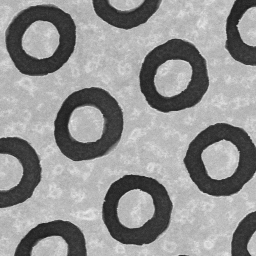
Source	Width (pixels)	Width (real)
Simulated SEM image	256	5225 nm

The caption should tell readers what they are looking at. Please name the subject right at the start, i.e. ring-shaped grooves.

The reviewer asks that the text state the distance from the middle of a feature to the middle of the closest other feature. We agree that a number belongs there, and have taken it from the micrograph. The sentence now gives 2 µm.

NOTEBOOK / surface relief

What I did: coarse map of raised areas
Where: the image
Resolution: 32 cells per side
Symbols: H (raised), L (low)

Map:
HHHHHHHHHHHHLLHHHHLLHHHHHHHHHLLL
HHHLLLLLHHHHLLLLLLLHHHHHHHHHHLLH
HHLLLLLLLHHHHLLLLLHHHHHHHHHHLLHH
HLLLHHHLLHHHHHHLLHHHHHHHHHHHLLHH
HLLHHHHLLHHHHHHHHHHHHHHHHHHHLLHH
HLLHHHHLLHHHHHHHHHHHLLLLHHHHLLLH
HLLHHHHLLHHHHHHHHHHLLLLLLHHHHLLL
HHLLLLLLHHHHHHHHHHLLLHHLLLHHHLLL
HHLLLLLHHHHHHHHHHHLLHHHHLLHHHHHH
HHHHLHHHHHHHHHHHHLLHHHHHLLHHHHHH
HHHHHHHHHHHHHHHHHLLHHHHHLLHHHHHH
HHHHHHHHHLLLLHHHHHLLHHHLLLHHHHHH
HHHHHHHHLLLLLLHHHHLLLLLLLHHHHHHH
HHHHHHHHLLHHLLLHHHHLLLLHHHHHHHHH
HHHHHHHLLHHHHLLHHHHHHHHHHHHHHHHH
HHHHHHHLLHHHHLLHHHHHHHHHHHHLHHHH
HHHHHHHLLHHHHLLHHHHHHHHHHLLLLLLH
LLLHHHHLLHHHLLLHHHHHHHHHLLLLLLLH
LLLLHHHLLLLLLLHHHHHHHHHLLLHHHHLL
HHLLLHHHLLLLLHHHHHHHHHHLLHHHHHLL
HHHLLHHHHHHHHHHHHHHHHHHLLHHHHHLL
HHHLLHHHHHHHHHHHHHHHHHHHLLHHHLLL
HHHLLHHHHHHHHHHLLLLHHHHHLLLLLLLH
HLLLHHHHHHHHHHLLLLLLLHHHHLLLLLHH
LLLLHHHHHHHHHLLHHHHLLHHHHHHHHHHH
LLHHHHHHHHHHHLLHHHHLLLHHHHHHHHHH
HHHHHHHHHHHHHLLHHHHLLHHHHHHHHHHH
HHHHHHHHHHHHHLLHHHHLLHHHHHHHHHLL
HHHHLLLLLLHHHLLLHLLLLHHHHHHHHHLL
HHHLLLLLLLHHHHLLLLLLHHHHHHHHHLLH
HHLLHHHHLLLHHHHHLLHHHHHHHHHHHLLH
HHLLHHHHLLLHHHHHHHHHHHHHHHHHHLLH